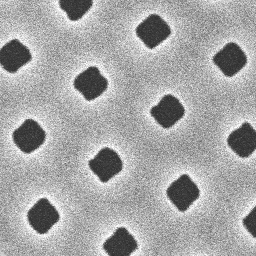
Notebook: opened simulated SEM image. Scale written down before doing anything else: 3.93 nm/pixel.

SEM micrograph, a regular array of holes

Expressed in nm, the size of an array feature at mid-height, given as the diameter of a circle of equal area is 126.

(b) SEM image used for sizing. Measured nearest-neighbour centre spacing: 320 nanometres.